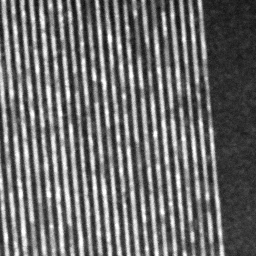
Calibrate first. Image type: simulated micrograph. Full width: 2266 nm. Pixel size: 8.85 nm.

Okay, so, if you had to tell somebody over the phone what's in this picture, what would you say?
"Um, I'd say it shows parallel lines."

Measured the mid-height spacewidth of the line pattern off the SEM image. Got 55.1 nm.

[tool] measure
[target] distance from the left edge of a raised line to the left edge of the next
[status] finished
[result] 9.31 pixels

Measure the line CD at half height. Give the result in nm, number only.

27.5